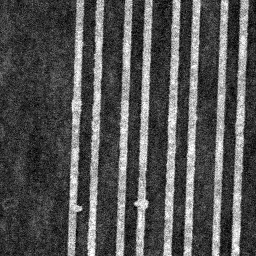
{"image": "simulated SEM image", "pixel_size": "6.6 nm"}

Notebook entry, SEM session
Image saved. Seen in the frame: parallel lines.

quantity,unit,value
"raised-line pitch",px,23.4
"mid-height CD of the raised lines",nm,47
